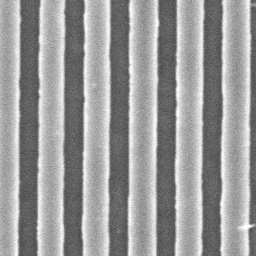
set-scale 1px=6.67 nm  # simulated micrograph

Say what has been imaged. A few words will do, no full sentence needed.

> lines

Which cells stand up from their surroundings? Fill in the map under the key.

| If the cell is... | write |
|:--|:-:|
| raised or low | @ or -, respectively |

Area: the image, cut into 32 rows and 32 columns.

@@---@@@---@@@--@@@@--@@@---@@@-
@@---@@@---@@@--@@@@--@@@---@@@-
@@---@@@---@@@--@@@@--@@@---@@@-
@@---@@@---@@@--@@@@--@@@---@@@-
@@---@@@---@@@--@@@@--@@@---@@@-
@@---@@@---@@@--@@@@--@@@---@@@-
@@---@@@---@@@--@@@@--@@@---@@@-
@@---@@@---@@@--@@@@--@@@---@@@-
@@---@@@---@@@--@@@@--@@@---@@@-
@@---@@@---@@@--@@@@--@@@---@@@-
@@---@@@---@@@--@@@@--@@@---@@@-
@@---@@@---@@@--@@@---@@@---@@@-
@@---@@@---@@@--@@@---@@@---@@@-
@@---@@@---@@@--@@@---@@@---@@@-
@@---@@@---@@@--@@@@--@@@---@@@-
@@---@@@---@@@--@@@---@@@---@@@-
@@---@@@---@@---@@@---@@@---@@@-
@@---@@@---@@---@@@---@@@---@@@-
@@---@@@---@@---@@@---@@@---@@@-
@@---@@@--@@@@--@@@---@@@---@@@-
@@---@@@--@@@@--@@@---@@@---@@@-
@@---@@@--@@@@--@@@---@@@---@@@-
@@---@@@--@@@---@@@---@@@---@@@-
@@---@@@--@@@---@@@---@@@---@@@-
@@---@@@--@@@---@@@---@@@---@@@-
@@---@@@--@@@---@@@---@@@---@@@-
@@---@@@--@@@---@@@---@@@---@@@-
@@---@@@--@@@---@@@---@@@---@@@-
@@---@@@--@@@---@@@---@@@---@@@-
@@---@@@--@@@---@@@---@@@---@@@-
@@---@@@--@@@---@@@---@@@---@@@-
@@---@@@--@@@---@@@---@@@---@@@-